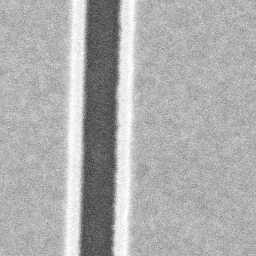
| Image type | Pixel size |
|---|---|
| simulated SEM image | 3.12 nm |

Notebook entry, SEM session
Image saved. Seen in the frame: one or a few lines or trenches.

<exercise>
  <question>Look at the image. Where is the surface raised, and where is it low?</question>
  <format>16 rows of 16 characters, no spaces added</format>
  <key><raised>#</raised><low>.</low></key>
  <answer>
#####...########
#####...########
#####...########
#####...########
#####...########
#####...########
#####...########
#####...########
#####...########
#####...########
#####...########
#####...########
#####...########
#####...########
#####...########
####....########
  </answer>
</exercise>